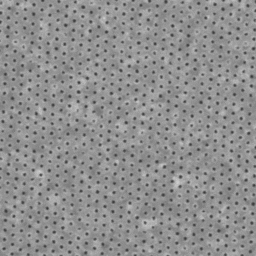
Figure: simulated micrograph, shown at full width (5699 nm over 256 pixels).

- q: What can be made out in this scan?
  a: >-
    a regular array of holes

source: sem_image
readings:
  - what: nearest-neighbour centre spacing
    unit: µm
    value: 0.204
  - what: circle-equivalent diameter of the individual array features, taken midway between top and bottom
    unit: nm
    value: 79.4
